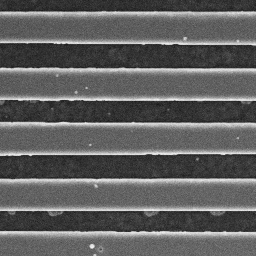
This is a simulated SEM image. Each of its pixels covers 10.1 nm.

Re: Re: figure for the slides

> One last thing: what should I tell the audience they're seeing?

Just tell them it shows lines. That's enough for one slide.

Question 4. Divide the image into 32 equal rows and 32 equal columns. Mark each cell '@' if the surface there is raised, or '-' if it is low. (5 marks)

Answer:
--------------------------------
--------------------------------
@@@@@@@@@@@@@@@@@@@@@@@@@@@@@@@@
@@@@@@@@@@@@@@@@@@@@@@@@@@@@@@@@
@@@@@@@@@@@@@@@@@@@@@@@@@@@@@@@@
------------------@-@@@@@@@@@@@@
--------------------------------
--------------------------------
--------------------------------
@@@@@@@@@@@@@@@@@@@@@@@@@@@@@@@@
@@@@@@@@@@@@@@@@@@@@@@@@@@@@@@@@
@@@@@@@@@@@@@@@@@@@@@@@@@@@@@@@@
--@--@@@@@@@@@@@@@@@@@@@@@@@@@@@
--------------------------------
--------------------------------
@@@@@@@@@@@@@@@@@@@@@@-@---@--@-
@@@@@@@@@@@@@@@@@@@@@@@@@@@@@@@@
@@@@@@@@@@@@@@@@@@@@@@@@@@@@@@@@
@@@@@@@@@@@@@@@@@@@@@@@@@@@@@@@@
--------------------------------
--------------------------------
--------------------------------
----@----@@@@@-@@----@-@@@@@@--@
@@@@@@@@@@@@@@@@@@@@@@@@@@@@@@@@
@@@@@@@@@@@@@@@@@@@@@@@@@@@@@@@@
@@@@@@@@@@@@@@@@@@@@@@@@@@@@@@@@
--------------------------------
--------------------------------
--------------------------------
@@@@@@@@@@@@@@@@@@@@@@@@@@@@@@@@
@@@@@@@@@@@@@@@@@@@@@@@@@@@@@@@@
@@@@@@@@@@@@@@@@@@@@@@@@@@@@@@@@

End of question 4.